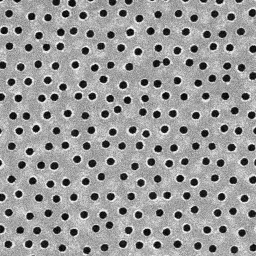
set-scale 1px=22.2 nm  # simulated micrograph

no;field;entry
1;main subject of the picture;a regular array of holes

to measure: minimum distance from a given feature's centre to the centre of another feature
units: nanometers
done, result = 350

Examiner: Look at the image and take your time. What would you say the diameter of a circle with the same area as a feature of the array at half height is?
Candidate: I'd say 184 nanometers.